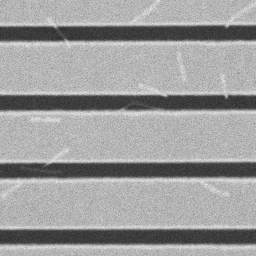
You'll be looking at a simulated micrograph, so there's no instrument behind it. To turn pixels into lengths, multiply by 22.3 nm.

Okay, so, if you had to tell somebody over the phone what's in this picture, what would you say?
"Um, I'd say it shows lines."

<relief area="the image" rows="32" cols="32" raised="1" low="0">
11111111111111111111111111111111
11111111111111111111111111111111
11111111111111111111111111111111
00000000000000000000000000000000
00000000000000000000000000000000
11111111111111111111111111111111
11111111111111111111111111111111
11111111111111111111111111111111
11111111111111111111111111111111
11111111111111111111111111111111
11111111111111111111111111111111
11111111111111111111111111111111
00000000000000000000000000000000
00000000000000000000000000000000
11111111111111111111111111111111
11111111111111111111111111111111
11111111111111111111111111111111
11111111111111111111111111111111
11111111111111111111111111111111
11111111111111111111111111111111
00000000000000000000000000000000
00000000000000000000000000000000
11111111111111111111111111111111
11111111111111111111111111111111
11111111111111111111111111111111
11111111111111111111111111111111
11111111111111111111111111111111
11111111111111111111111111111111
11111111111111111111111111111111
00000000000000000000000000000000
00000000000000000000000000000000
11111111111111111111111111111111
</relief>